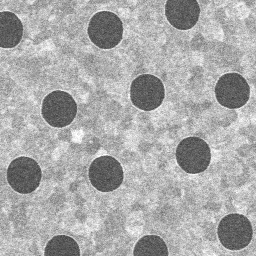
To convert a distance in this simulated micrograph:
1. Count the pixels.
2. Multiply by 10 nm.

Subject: a regular array of holes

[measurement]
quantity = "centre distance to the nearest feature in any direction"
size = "755 nm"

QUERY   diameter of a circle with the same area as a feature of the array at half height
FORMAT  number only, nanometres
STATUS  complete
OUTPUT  371